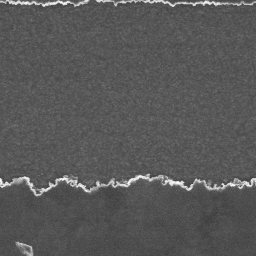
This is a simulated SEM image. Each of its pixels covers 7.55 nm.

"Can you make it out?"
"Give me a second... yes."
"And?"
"one or a few lines or trenches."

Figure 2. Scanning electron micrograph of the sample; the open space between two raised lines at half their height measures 176 px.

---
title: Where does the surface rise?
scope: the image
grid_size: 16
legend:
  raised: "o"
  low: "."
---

................
................
................
................
................
................
................
................
................
................
................
oo.oo.ooooo.o.oo
oooooooooooooooo
oooooooooooooooo
oooooooooooooooo
oooooooooooooooo